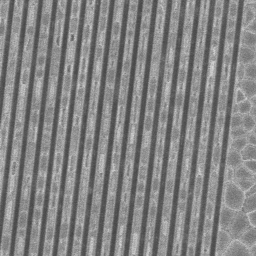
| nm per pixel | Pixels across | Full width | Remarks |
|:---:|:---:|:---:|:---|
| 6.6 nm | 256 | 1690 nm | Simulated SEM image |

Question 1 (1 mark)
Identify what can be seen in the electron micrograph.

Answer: parallel lines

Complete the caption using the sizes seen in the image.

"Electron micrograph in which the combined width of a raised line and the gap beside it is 94 nm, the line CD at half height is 58.2 nm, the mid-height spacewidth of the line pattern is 0.0352 µm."